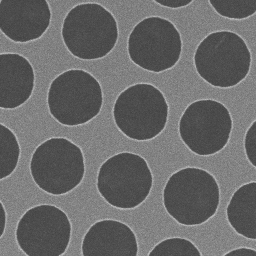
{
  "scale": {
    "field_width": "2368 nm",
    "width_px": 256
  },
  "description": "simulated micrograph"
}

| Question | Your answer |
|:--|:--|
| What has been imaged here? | a regular array of holes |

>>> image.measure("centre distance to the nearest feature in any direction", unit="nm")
626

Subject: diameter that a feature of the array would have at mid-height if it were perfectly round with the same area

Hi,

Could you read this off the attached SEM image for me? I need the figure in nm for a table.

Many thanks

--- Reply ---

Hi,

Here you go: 508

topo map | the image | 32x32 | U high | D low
DDDDDDUUUUDDUUUUUUUUDDDUUUDDDDDD
DDDDDDUUUDDDDDUUUUUUUUUUUUUDDDDD
DDDDDDUUDDDDDDUUUUDDDUUUUUUUUUUU
DDDDDDUUDDDDDDDUUDDDDDUUUUUUUUUU
UDDDDUUUDDDDDDDUDDDDDDUUUUDDDDUU
UUUUUUUUDDDDDDUUDDDDDDDUUDDDDDDU
UUUUUUUUUDDDDDUUDDDDDDDUUDDDDDDU
DDDUUUUUUUUUUUUUUDDDDDUUDDDDDDDU
DDDDUUUUUUUUUUUUUUDDDUUUUDDDDDDU
DDDDUUUDDDDUUUUUUUUUUUUUUDDDDDDU
DDDDUUDDDDDDUUUUUUUUUUUUUUDDDDUU
DDDDUUDDDDDDDUUDDDDDUUUUUUUUUUUU
DDDUUUDDDDDDDUUDDDDDDUUUUUUUUUUU
UDUUUUDDDDDDDUDDDDDDDUUDDDDDUUUU
UUUUUUUDDDDDUUDDDDDDDUUDDDDDDUUU
UUUUUUUUDDUUUUUDDDDDDUDDDDDDDUUU
DUUUUUUUUUUUUUUDDDDDUUDDDDDDDUUD
DDUUUUDDUUUUUUUUUDUUUUUDDDDDUUUD
DDUUUDDDDDUUUUUUUUUUUUUUDDDDUUUD
DDUUDDDDDDUUUUDDDUUUUUUUUUUUUUUD
DDUUDDDDDDUUUDDDDDUUUUUUUUUUUUUU
DDUUDDDDDDUUDDDDDDDUUUDDDDUUUUUU
UUUUDDDDDDUUDDDDDDDUUDDDDDDUUUUU
UUUUUDDDDUUUDDDDDDDUUDDDDDDUUUDD
UUUUUUUUUUUUUDDDDDUUDDDDDDDUUDDD
UUUUUUUUUUUUUUDDDUUUUDDDDDDUUDDD
DUUDDDDDUUUUUUUUUUUUUDDDDDDUDDDD
DUUDDDDDDUUUUUUUUUUUUUDDDDUUUDDD
DUDDDDDDDUUDDDDDUUUUUUUUUUUUUDDD
UUDDDDDDDUUDDDDDDUUUUUUUUUUUUUDD
UUDDDDDDDUDDDDDDDUUUDDDDUUUUUUUU
UUUDDDDDUUDDDDDDDUUDDDDDDUUUUDDD